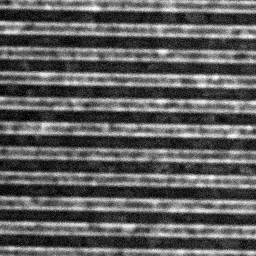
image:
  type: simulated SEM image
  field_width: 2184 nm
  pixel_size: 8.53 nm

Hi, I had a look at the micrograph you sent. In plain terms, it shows parallel lines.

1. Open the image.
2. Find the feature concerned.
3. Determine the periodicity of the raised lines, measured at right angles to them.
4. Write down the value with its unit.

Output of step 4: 25 pixels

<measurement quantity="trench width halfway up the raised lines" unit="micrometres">0.13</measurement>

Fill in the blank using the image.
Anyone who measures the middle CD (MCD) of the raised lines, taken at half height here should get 81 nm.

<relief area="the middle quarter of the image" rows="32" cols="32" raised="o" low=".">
................................
................................
................................
oooooooooooooooooooooooooooooooo
oooooooooooooooooooooooooooooooo
................................
................................
................................
................................
oooooooooooooooooooooooooooooooo
oooooooooooooooooooooooooooooooo
...........................ooooo
................................
................................
................................
oooooooooooooooooooooooo........
oooooooooooooooooooooooooooooooo
................oooooooooooooooo
................................
................................
................................
oooooooooooooo..................
oooooooooooooooooooooooooooooooo
oooooooooooooooooooooooooooooooo
................................
................................
................................
................................
oooooooooooooooooooooooooooooooo
oooooooooooooooooooooooooooooooo
................................
................................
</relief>